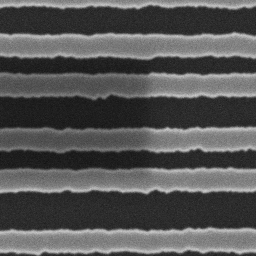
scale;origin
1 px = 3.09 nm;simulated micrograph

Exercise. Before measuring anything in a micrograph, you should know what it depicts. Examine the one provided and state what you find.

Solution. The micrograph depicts lines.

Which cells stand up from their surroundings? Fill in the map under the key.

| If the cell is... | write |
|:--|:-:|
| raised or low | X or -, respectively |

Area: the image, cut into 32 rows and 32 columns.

XXXXXXXXXXXXXXXXXXXXXXXXXXXXXXXX
--------------------------------
--------------------------------
--------------------------------
XXXXXXXXXXXXXXXXXXXXXXX-XXXXXXXX
XXXXXXXXXXXXXXXXXXXXXXXXXXXXXXXX
XXXXXXXXXXXXXXXXXXXXXXXXXXXXXXXX
--------------------------------
--------------------------------
XXXXXXXXXXXXXXXXXXXXXXXXXXXXXXXX
XXXXXXXXXXXXXXXXXXXXXXXXXXXXXXXX
XXXXXXXXXXXXXXXXXXXXXXXXXXXXXXXX
--------------------------------
--------------------------------
--------------------------------
--------------------------------
XXXXXXXXXXXXXXXXXXXXXXXXXXXXXXXX
XXXXXXXXXXXXXXXXXXXXXXXXXXXXXXXX
XXXXXXXXXXXXXXXXXXXXXXXXXXXXXXXX
--------------------------------
--------------------------------
XXXXXXXXXXXXXXXXXXXXXXXXXXXXXXXX
XXXXXXXXXXXXXXXXXXXXXXXXXXXXXXXX
XXXXXXXXXXXXXXXXXXXXXXXXXXXXXXXX
--------------------------------
--------------------------------
--------------------------------
--------------------------------
--------------------------------
XXXXXXXXXXXXXXXXXXXXXXXXXXXXXXXX
XXXXXXXXXXXXXXXXXXXXXXXXXXXXXXXX
XXXXXXXXXXXXXX---XXX--X--X--XXXX